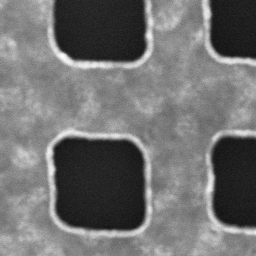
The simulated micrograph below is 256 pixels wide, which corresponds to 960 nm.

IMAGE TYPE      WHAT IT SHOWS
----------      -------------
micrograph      holes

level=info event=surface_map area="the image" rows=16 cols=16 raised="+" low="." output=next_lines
+++......++++...
+++......++++...
+++......++++...
++++.....+++++..
++++++++++++++++
++++++++++++++++
++++++++++++++++
++++++++++++++++
++++++++++++++.+
+++......++++...
+++......++++...
+++......++++...
+++......++++...
++++.....++++...
++++++++++++++++
++++++++++++++++